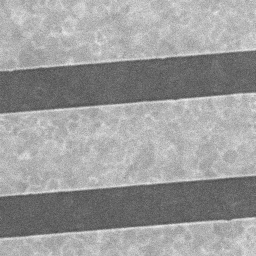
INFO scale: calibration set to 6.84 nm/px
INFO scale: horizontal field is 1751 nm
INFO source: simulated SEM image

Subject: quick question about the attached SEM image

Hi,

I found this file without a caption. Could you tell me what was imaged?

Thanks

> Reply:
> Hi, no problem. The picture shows one or a few lines or trenches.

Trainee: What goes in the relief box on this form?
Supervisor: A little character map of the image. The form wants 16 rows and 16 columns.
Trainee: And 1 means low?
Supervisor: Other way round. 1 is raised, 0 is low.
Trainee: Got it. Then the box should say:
1111111111111111
1111111111111111
1111111111111111
1111111111100000
0000000000000000
0000000000000000
0000000011111111
1111111111111111
1111111111111111
1111111111111111
1111111111111111
1111111110000000
0000000000000000
0000000000000000
0000011111111111
1111111111111111